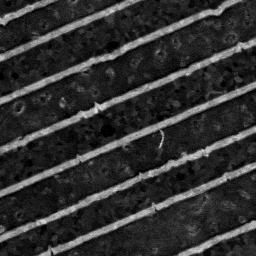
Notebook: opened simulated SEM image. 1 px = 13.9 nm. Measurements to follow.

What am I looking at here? one or a few lines or trenches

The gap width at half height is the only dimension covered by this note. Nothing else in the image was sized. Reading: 43.3 px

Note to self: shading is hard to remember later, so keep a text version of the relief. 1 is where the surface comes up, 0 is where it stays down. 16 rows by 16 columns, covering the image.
1100000111111100
0000011111100000
0001111110000000
1111111000000011
1111000000001111
1100000001111111
0000000111111000
0000011111100000
0011111100000001
1111110000000111
1111000000111110
1000000011111000
0000001111100000
0000111100000000
0111110000000001
1111000000000111